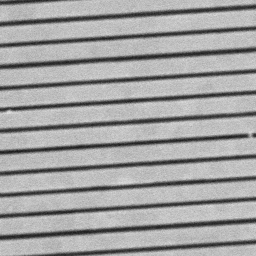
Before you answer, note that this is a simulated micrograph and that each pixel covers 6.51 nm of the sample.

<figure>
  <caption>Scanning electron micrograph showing parallel lines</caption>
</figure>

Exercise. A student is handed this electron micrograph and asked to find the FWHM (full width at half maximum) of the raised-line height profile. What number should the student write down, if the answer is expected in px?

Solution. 16.2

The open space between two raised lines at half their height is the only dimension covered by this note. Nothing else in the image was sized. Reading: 5.61 px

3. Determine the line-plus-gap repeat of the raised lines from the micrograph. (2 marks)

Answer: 139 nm